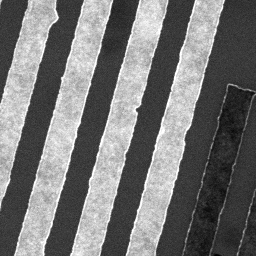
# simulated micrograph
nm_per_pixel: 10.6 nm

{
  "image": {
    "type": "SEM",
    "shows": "parallel lines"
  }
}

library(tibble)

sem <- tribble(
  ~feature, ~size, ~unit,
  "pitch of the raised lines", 567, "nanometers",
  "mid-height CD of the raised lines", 283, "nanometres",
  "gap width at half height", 282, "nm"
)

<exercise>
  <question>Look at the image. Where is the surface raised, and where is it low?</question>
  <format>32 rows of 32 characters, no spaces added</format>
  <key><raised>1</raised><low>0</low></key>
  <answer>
00001110001111000111100011110000
00011110001111000111100011110000
00011110001110000111000011100000
00011100001110000111000111100000
00111100011110001111000111100000
00111100011110001111000111100000
00111000011100001110000111000000
00111000111100001110000111000000
01111000111100011110001111000000
01111000111100011100001110000000
01110000111000011100001110000000
01110001111000111100011110001111
11110001111000111100011110001110
11100001110000111000011100001110
11100001110000111000011100011110
11100011110001111000111100011110
11100011110001111000111000011100
11000011100001110000111000011100
11000011100011110001111000111100
11000111100011110001111000111100
11000111100011100001110000111000
10000111000011100001110000111000
10000111000111100011110001111000
10001111000111100011110001111000
00001110000111000011100001110000
00001110000111000011100001110001
00011110001111000111100011110001
00011110001111000111100011100001
00011100001110000111000011100001
00111100001110001111000111100011
00111100011110001111000111100011
00111000011110001110000111000011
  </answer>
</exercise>